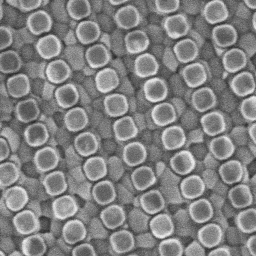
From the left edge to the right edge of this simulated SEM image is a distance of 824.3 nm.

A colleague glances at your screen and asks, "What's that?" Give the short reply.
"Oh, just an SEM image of a regular array of raised bodies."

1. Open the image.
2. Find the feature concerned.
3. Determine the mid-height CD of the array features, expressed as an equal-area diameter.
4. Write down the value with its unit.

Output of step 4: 72.7 nanometers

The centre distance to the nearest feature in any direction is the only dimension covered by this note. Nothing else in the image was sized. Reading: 0.0826 microns